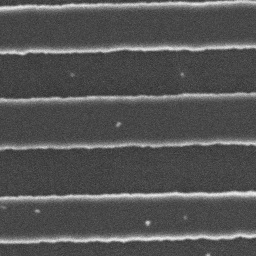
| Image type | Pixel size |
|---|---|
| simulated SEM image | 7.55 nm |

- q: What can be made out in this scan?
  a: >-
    lines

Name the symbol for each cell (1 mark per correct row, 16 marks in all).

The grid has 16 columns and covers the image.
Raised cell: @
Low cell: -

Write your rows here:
@@@@@@@@@@@@@@@@
@@@@@@@@@@@@@@@@
@@@@@@@@@@@@@@@@
----------------
----------------
----------------
@@@@@@@@@@@@@@@@
@@@@@@@@@@@@@@@@
@@@@@@@@@@@@@@@@
----------------
----------------
----------------
@@@@@@@@@@@@@@@@
@@@@@@@@@@@@@@@@
@@@@@@@@@@@@@@@@
----------------